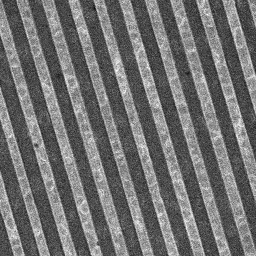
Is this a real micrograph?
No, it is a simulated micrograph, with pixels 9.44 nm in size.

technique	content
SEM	parallel lines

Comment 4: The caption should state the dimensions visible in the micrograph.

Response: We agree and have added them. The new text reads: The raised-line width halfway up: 97.4 nm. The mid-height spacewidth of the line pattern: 0.138 µm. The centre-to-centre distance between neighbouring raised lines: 233 nm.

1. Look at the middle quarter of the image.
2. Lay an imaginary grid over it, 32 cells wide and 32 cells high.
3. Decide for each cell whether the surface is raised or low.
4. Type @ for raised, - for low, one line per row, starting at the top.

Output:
@@----@@----@@@----@@----@@@---@
@@----@@@----@@----@@@---@@@----
@@@----@@----@@----@@@----@@----
@@@----@@----@@@----@@----@@----
@@@----@@@----@@----@@----@@@---
-@@----@@@----@@----@@@----@@---
-@@@----@@----@@@---@@@----@@@--
-@@@----@@@---@@@----@@----@@@--
--@@----@@@----@@----@@@---@@@--
--@@@----@@----@@----@@@----@@--
--@@@----@@----@@-----@@----@@@-
---@@----@@@----@@----@@@---@@@-
---@@@---@@@----@@----@@@----@@-
---@@@----@@----@@@---@@@----@@@
---@@@----@@----@@@----@@----@@@
----@@@---@@@----@@----@@@----@@
----@@@----@@----@@----@@@----@@
@---@@@----@@----@@@----@@----@@
@----@@----@@@----@@----@@@---@@
@----@@@----@@----@@----@@@----@
@@---@@@----@@----@@@----@@----@
@@---@@@----@@@----@@----@@----@
@@----@@@----@@----@@----@@@----
@@----@@@----@@----@@@---@@@----
@@@---@@@----@@@---@@@----@@----
@@@----@@@---@@@----@@----@@@---
@@@----@@@----@@----@@----@@@---
-@@@---@@@----@@----@@@----@@---
-@@@----@@----@@@----@@----@@@--
--@@----@@@----@@----@@----@@@--
--@@@---@@@----@@----@@@---@@@--
--@@@---@@@----@@@---@@@----@@--